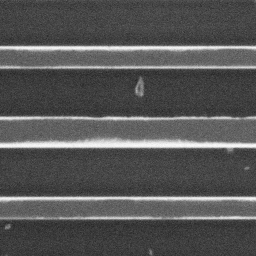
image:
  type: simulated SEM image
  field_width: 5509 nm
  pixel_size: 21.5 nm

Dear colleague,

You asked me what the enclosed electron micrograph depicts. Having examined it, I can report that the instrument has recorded lines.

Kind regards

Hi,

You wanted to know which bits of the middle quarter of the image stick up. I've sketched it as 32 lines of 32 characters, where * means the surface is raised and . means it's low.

********************************
................................
................................
................................
................................
................................
................................
................................
................................
................................
................................
................................
................................
**..............................
********************************
********************************
********************************
********************************
********************************
********************************
*******.......*******......*****
................................
................................
................................
................................
................................
................................
................................
................................
................................
................................
................................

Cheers